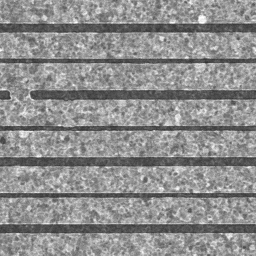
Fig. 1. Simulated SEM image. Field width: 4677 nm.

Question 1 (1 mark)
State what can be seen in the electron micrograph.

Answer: parallel lines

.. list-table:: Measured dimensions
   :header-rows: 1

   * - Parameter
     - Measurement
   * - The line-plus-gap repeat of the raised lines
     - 604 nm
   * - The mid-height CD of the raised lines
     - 461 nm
